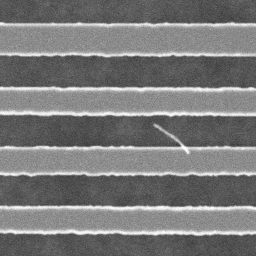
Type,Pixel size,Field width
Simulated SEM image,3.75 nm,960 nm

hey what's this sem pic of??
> lines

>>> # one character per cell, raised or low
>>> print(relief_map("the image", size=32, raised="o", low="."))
................................
................................
................................
oooooooooooooooooooooooooooooooo
oooooooooooooooooooooooooooooooo
oooooooooooooooooooooooooooooooo
oooooooooooooooooooooooooooooooo
................................
................................
................................
................................
oooooooooooooooooooooooooooooooo
oooooooooooooooooooooooooooooooo
oooooooooooooooooooooooooooooooo
................................
................................
................................
................................
oooooooooooooooooooooooooooooooo
oooooooooooooooooooooooooooooooo
oooooooooooooooooooooooooooooooo
oooooooooooooooooooooooooooooooo
................................
................................
................................
................................
oooooooooooooooooooooooooooooooo
oooooooooooooooooooooooooooooooo
oooooooooooooooooooooooooooooooo
................................
................................
................................